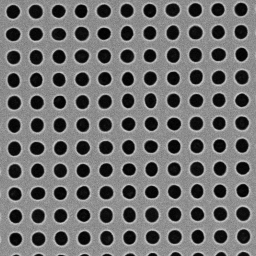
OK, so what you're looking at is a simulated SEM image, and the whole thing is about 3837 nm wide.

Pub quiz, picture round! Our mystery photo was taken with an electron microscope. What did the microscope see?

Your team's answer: a regular array of holes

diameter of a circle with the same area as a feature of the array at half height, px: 13.4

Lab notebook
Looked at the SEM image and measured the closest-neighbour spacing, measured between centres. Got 335 nm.